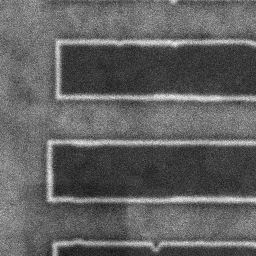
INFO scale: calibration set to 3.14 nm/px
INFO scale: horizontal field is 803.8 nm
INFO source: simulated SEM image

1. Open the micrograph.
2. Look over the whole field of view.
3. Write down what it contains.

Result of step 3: one or a few lines or trenches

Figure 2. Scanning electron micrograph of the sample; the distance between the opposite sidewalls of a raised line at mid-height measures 182 nanometres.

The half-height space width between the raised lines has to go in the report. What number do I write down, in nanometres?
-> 134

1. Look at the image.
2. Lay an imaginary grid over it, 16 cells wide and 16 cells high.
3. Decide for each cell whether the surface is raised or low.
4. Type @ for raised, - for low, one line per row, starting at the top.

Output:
----------------
----------------
----------------
----@@@@@@@@@@@@
----@@@@@@@@@@@@
----@@@@@@@@@@@@
----------------
----------------
----------------
---@@@@@@@@@@@@@
---@@@@@@@@@@@@@
---@@@@@@@@@@@@@
---@@@@@@@@@@@@@
----------------
----------------
---@@@@@@@@@@@@@